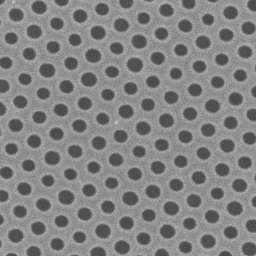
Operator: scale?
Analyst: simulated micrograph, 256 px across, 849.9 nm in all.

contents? a regular array of holes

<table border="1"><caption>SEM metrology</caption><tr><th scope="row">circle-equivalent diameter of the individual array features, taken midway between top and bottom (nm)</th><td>45.1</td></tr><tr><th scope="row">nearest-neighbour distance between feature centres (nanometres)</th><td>77.6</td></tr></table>